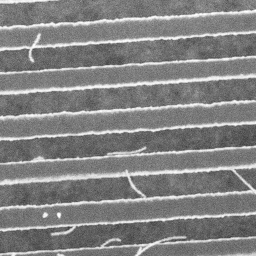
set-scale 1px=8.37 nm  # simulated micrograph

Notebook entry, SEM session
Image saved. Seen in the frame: lines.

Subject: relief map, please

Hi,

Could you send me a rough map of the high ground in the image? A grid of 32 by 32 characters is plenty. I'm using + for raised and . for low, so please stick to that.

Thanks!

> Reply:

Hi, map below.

................................
..............................++
...............+++++++++++++++++
++++++++++++++++++++++++++++++++
++++++++++++++++++++++++++......
++++++++++......................
................................
..........................++++++
.........+++++++++++++++++++++++
++++++++++++++++++++++++++++++++
++++++++++++++++++..............
++++............................
................................
.................+++++++++++++++
..++++++++++++++++++++++++++++++
++++++++++++++++++++++++++++++..
+++++++++++++++++...............
................................
............................++++
..............++++++++++++++++++
++++++++++++++++++++++++++++++++
+++++++++++++++++++++++.........
++++++..........................
................................
.......................+++++++++
.......+++++++++++++++++++++++++
++++++++++++++++++++++++++++++++
++++++++++++++++++++............
++++............................
................................
..................++++++++++++++
....++++++++++++++++++++++++++++